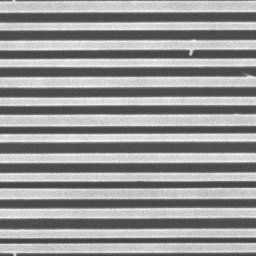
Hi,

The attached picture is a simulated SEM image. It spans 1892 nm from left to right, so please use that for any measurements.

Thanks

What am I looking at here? parallel lines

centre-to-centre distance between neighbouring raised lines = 137 nanometres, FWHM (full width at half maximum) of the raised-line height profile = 0.0739 um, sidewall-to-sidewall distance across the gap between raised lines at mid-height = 9 pixels